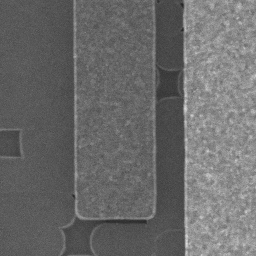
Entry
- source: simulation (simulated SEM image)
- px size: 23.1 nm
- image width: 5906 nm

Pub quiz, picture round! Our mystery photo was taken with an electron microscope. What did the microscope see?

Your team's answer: wiring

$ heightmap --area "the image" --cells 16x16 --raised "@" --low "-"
-----@@@@@--@@@@
-----@@@@@--@@@@
-----@@@@@--@@@@
-----@@@@@--@@@@
-----@@@@@--@@@@
-----@@@@@--@@@@
-----@@@@@--@@@@
-----@@@@@--@@@@
-----@@@@@--@@@@
-----@@@@@--@@@@
-----@@@@@--@@@@
-----@@@@@--@@@@
-----@@@@@--@@@@
-----@@@@---@@@@
------------@@@@
------------@@@@